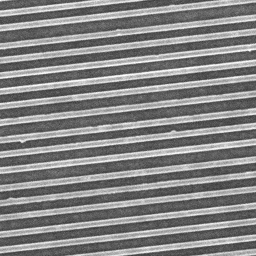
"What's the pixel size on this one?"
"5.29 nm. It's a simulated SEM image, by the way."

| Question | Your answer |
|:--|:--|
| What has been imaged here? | parallel lines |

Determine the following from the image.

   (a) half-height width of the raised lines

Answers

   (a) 30.9 nm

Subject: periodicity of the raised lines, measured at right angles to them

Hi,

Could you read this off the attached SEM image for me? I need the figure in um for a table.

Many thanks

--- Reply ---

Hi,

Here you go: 0.0832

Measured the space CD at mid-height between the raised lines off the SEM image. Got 53.2 nanometres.